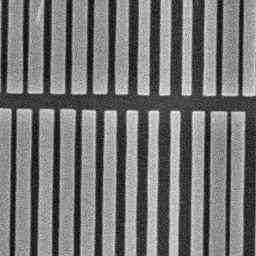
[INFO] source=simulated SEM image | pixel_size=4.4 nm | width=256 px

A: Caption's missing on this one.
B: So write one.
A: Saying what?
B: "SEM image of groups of lines, slits or small figures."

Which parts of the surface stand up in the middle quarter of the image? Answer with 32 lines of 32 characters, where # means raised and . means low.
..###..####..###...##...##....##
..###..####..###...##...##....##
..###..####..###...##...##....##
..###..####..###...##...##....##
..###..####..###...##...##....##
..###..####..###...##...##....##
..###..####..###...##...##....##
....................#...##....##
................................
................................
................................
................................
###..###..###...##...##....##...
###..###..###...##...##....##...
###..###..###...##...##....##...
###..###..###...##...##....##...
###..###..###...##...##....##...
###..###..###...##...##....##...
###..###..###...##...##....##...
###..###..###...##...##....##...
###..###..###...##...##....##...
###..###..###...##...##....##...
###..###..###...##...##....##...
###..###..###...##...##....##...
##...###..###...##...##....##...
##...###..###...##...##....##...
##...###..###...##...##....##...
##...###..###...##...##....##...
###..###..###...##...##....##...
###..###..###...##...##....##...
###.####..###...##...##....##...
###.####..###...##...##....##...